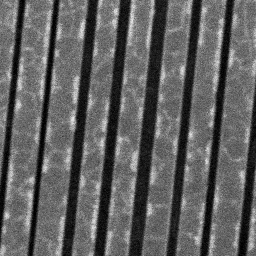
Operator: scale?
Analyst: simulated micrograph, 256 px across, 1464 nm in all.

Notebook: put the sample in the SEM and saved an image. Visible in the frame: parallel lines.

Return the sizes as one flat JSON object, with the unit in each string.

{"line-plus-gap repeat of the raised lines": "34.7 px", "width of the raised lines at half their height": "0.137 µm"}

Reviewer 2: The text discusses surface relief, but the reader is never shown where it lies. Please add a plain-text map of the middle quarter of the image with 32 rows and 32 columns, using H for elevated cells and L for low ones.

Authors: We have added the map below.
HHHHLLLHHHHHLLLHHHHHHLLLLHHHHHLL
HHHHLLLHHHHHLLLHHHHHHLLLLHHHHHLL
HHHHLLLHHHHHLLLHHHHHHLLLHHHHHHLL
HHHHLLLHHHHHLLLHHHHHLLLLHHHHHHLL
HHHHLLLHHHHHLLLHHHHHLLLLHHHHHHLL
HHHHLLLHHHHHLLLHHHHHLLLLHHHHHHLL
HHHHLLHHHHHHLLLHHHHHLLLLHHHHHHLL
HHHLLLHHHHHLLLLHHHHHLLLLHHHHHHLL
HHHLLLHHHHHLLLLHHHHHLLLLHHHHHLLL
HHHLLLHHHHHLLLHHHHHHLLLLHHHHHLLL
HHHLLLHHHHHLLLHHHHHHLLLLHHHHHLLL
HHHLLLHHHHHLLLHHHHHHLLLLHHHHHLLL
HHHLLLHHHHHLLLHHHHHLLLLHHHHHHLLL
HHHLLLHHHHHLLLHHHHHLLLLHHHHHHLLL
HHHLLLHHHHHLLLHHHHHLLLLHHHHHHLLL
HHHLLLHHHHHLLLHHHHHLLLLHHHHHHLLH
HHHLLHHHHHHLLLHHHHHLLLLHHHHHHLLH
HHLLLHHHHHLLLLHHHHHLLLLHHHHHHLLH
HHLLLHHHHHLLLLHHHHHLLLLHHHHHLLLH
HHLLLHHHHHLLLHHHHHHLLLLHHHHHLLLH
HHLLLHHHHHLLLHHHHHHLLLLHHHHHLLLH
HHLLLHHHHHLLLHHHHHHLLLLHHHHHLLLH
HHLLLHHHHHLLLHHHHHLLLLHHHHHHLLLH
HHLLLHHHHHLLLHHHHHLLLLHHHHHHLLLH
HHLLLHHHHHLLLHHHHHLLLLHHHHHHLLLH
HHLLHHHHHHLLLHHHHHLLLLHHHHHHLLHH
HLLLHHHHHHLLLHHHHHLLLLHHHHHLLLHH
HLLLHHHHHLLLLHHHHHLLLLHHHHHLLLHH
HLLLHHHHHLLLHHHHHHLLLLHHHHHLLLHH
HLLLHHHHHLLLHHHHHHLLLLHHHHHLLLHH
HLLLHHHHHLLLHHHHHHLLLLHHHHHLLLHH
HLLLHHHHHLLLHHHHHHLLLHHHHHHLLLHH